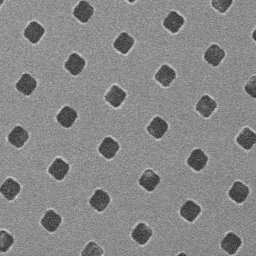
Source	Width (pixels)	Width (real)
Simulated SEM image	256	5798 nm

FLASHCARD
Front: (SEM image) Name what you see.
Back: a regular array of holes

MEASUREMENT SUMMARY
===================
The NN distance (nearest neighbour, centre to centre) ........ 1170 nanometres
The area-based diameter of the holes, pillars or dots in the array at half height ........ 473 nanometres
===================